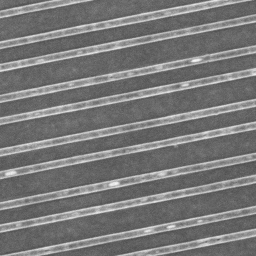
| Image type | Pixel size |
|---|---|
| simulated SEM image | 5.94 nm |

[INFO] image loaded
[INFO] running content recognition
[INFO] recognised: parallel lines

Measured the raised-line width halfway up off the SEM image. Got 0.0423 microns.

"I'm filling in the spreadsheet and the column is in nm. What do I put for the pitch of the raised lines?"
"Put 156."